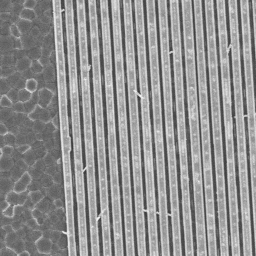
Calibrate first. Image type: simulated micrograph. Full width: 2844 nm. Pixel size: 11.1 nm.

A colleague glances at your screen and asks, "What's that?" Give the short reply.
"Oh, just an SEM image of parallel lines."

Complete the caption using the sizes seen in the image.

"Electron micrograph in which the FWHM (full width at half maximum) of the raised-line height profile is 76.2 nanometres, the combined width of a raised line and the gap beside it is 130 nm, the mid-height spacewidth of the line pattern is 56.8 nanometers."